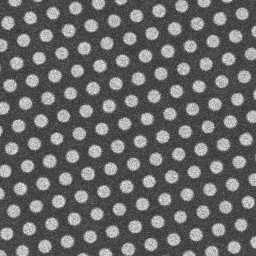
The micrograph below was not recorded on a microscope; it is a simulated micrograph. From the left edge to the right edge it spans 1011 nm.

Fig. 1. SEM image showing a regular array of raised bodies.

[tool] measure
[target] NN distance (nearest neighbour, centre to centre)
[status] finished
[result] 90.9 nanometers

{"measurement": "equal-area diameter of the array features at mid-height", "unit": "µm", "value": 0.0492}